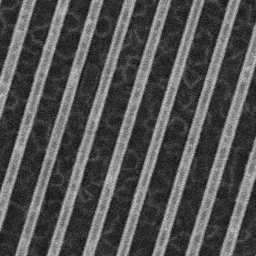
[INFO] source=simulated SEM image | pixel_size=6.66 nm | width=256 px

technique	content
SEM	parallel lines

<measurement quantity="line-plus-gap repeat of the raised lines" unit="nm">218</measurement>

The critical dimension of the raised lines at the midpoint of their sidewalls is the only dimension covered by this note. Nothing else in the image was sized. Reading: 0.0606 microns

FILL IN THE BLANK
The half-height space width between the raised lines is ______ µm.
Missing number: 0.157